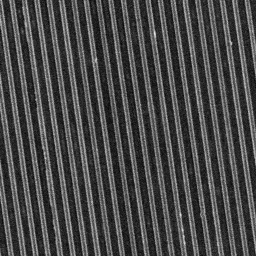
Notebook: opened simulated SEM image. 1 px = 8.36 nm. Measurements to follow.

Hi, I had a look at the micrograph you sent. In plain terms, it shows parallel lines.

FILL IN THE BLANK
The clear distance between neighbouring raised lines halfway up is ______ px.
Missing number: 8.3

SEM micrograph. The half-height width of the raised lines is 4.57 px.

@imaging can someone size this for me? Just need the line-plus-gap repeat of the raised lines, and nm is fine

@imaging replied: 102